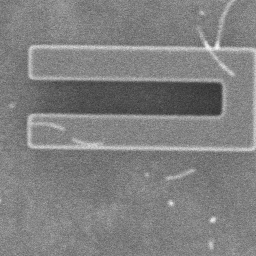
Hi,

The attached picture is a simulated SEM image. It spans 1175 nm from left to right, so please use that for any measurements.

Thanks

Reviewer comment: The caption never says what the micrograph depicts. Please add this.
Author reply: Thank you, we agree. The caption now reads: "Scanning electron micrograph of groups of lines, slits or small figures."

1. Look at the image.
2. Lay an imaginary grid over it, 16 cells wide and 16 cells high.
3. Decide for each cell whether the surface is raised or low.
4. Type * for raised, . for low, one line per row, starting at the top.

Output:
................
................
................
..**************
..**************
..............**
..............**
..**************
..**************
................
................
................
................
................
................
................